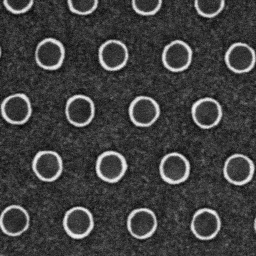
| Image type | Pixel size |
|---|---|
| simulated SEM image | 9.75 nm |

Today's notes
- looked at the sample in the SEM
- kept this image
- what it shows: a regular array of raised bodies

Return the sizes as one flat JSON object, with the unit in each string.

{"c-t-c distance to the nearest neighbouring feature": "618 nanometers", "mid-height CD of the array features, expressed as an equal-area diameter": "276 nm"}